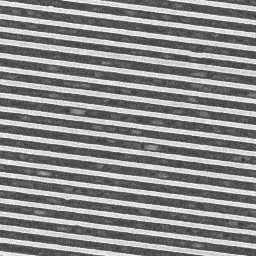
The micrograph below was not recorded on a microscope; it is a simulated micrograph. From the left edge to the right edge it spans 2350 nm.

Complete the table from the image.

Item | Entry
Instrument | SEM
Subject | parallel lines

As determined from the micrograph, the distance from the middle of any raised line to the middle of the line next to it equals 120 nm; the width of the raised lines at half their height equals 40.9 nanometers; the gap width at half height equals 75.2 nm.